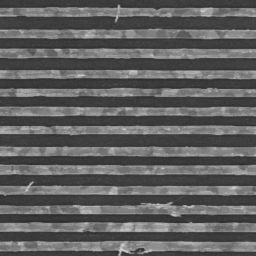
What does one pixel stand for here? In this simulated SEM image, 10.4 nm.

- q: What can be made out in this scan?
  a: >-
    parallel lines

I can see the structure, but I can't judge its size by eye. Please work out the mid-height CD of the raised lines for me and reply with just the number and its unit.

87 nanometers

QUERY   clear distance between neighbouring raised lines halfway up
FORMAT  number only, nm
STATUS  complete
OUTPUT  117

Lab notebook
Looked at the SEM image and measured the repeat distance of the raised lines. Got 203 nm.